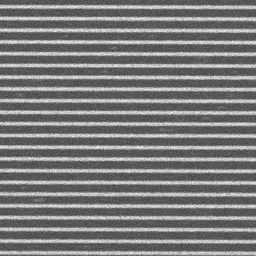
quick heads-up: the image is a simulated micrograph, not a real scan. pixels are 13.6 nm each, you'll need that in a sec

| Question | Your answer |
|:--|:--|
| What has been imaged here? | parallel lines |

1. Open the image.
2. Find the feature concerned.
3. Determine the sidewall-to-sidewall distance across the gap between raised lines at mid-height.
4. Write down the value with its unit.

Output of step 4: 107 nm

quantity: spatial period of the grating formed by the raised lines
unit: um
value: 0.16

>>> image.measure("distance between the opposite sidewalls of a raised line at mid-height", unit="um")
0.0477